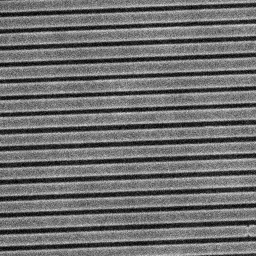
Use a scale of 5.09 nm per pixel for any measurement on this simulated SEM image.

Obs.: parallel lines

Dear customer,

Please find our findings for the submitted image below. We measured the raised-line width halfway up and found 61.1 nanometers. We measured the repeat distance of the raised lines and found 85.2 nm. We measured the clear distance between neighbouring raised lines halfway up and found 23.5 nm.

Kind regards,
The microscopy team